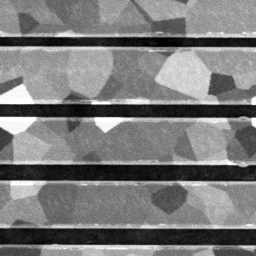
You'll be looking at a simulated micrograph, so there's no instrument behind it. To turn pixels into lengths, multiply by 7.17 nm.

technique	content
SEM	one or a few lines or trenches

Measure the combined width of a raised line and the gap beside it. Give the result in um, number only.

0.463